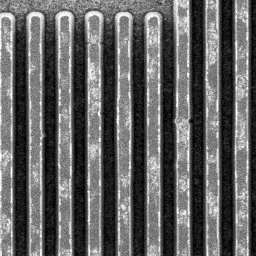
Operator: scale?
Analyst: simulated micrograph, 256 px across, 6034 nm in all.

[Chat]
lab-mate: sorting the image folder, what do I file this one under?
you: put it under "parallel lines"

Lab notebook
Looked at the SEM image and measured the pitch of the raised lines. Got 695 nm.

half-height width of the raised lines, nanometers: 342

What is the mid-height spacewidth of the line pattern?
365 nm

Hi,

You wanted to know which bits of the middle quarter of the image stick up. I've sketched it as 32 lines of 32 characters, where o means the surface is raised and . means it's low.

oo....ooo....oooo....ooo....ooo.
oo....ooo....oooo....ooo....ooo.
oo....ooo.....ooo....ooo....ooo.
oo....ooo.....ooo....ooo....ooo.
oo....ooo....oooo....ooo....ooo.
oo....ooo....oooo....ooo....ooo.
oo....ooo....oooo....ooo....ooo.
oo....ooo....oooo....ooo....ooo.
oo....ooo....oooo....ooo....ooo.
oo....ooo....oooo....ooo....ooo.
oo....ooo....oooo....ooo....ooo.
oo....ooo....oooo....ooo....ooo.
oo....ooo....oooo....ooo....ooo.
oo....ooo....oooo....ooo....ooo.
oo....ooo....oooo....ooo....ooo.
oo....ooo....oooo....ooo....ooo.
oo....ooo....oooo....ooo....ooo.
oo....ooo....oooo....ooo....oooo
oo....ooo....oooo....ooo....oooo
oo....ooo....oooo....ooo....oooo
oo....ooo....oooo....ooo....oooo
oo....ooo....oooo....ooo....oooo
oo....ooo....oooo....ooo....ooo.
oo....ooo....oooo....ooo....ooo.
oo....ooo....oooo....ooo....ooo.
oo....ooo....oooo....ooo....ooo.
oo....ooo....oooo....ooo....ooo.
oo....ooo....oooo....ooo....ooo.
oo....ooo....oooo....ooo....ooo.
oo....ooo.....ooo....ooo....ooo.
oo....ooo.....ooo....ooo....ooo.
oo....ooo.....ooo....ooo....ooo.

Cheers